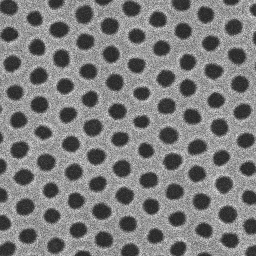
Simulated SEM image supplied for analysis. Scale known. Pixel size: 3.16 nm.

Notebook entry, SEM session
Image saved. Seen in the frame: a regular array of holes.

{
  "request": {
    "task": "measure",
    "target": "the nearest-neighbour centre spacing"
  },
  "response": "86.5 nm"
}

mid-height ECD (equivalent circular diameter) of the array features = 0.0539 µm